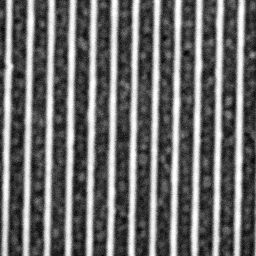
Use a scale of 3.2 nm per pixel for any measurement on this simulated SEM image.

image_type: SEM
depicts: parallel lines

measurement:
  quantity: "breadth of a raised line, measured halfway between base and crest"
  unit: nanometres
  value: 18.4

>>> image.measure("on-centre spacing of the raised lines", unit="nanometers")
67.4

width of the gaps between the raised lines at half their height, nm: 49.1